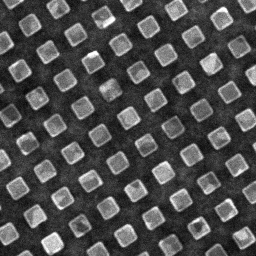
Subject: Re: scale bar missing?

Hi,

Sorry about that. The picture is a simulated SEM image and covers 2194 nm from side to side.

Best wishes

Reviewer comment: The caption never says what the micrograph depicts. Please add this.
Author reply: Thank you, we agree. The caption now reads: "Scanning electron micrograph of a regular array of raised bodies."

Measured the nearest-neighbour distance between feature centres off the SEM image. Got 279 nm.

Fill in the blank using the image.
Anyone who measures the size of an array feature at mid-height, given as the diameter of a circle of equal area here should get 172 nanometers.